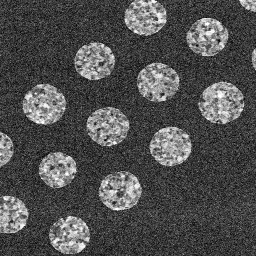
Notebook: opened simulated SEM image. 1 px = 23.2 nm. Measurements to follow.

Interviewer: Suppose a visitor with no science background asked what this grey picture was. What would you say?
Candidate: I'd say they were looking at a regular array of raised bodies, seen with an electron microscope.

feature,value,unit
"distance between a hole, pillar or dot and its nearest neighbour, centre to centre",1540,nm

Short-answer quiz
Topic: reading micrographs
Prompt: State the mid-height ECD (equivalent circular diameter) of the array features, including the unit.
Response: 900 nm